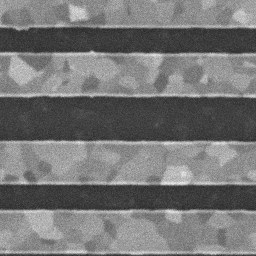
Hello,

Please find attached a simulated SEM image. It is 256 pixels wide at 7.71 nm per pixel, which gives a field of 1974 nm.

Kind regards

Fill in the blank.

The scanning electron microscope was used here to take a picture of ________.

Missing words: one or a few lines or trenches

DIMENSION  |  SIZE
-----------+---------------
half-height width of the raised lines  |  320 nanometers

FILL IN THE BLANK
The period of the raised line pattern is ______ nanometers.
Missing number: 606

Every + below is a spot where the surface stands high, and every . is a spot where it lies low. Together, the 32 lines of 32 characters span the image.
++++++++++++++++++++++++++++++++
++++++++++++++++++++++++++++++++
++++++++++++++++++++++++++++++++
..+.............................
................................
................................
................................
++++++++++++++++++++++++++++++++
++++++++++++++++++++++++++++++++
++++++++++++++++++++++++++++++++
++++++++++++++++++++++++++++++++
++++++++++++++++++++++++++++++++
................................
................................
................................
................................
................................
................................
++++++++++++++++++++++++++++++++
++++++++++++++++++++++++++++++++
++++++++++++++++++++++++++++++++
++++++++++++++++++++++++++++++++
++++++++++++++++++++++++++++++++
................................
................................
................................
++++++++++++++.++++++...++...++.
++++++++++++++++++++++++++++++++
++++++++++++++++++++++++++++++++
++++++++++++++++++++++++++++++++
++++++++++++++++++++++++++++++++
+++++++++.++++++++++++++++++++++